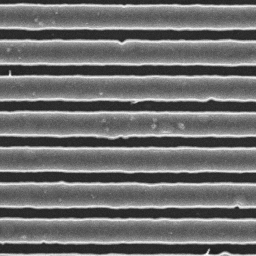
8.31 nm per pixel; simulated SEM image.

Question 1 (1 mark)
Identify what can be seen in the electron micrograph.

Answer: parallel lines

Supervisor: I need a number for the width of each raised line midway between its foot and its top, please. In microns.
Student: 0.204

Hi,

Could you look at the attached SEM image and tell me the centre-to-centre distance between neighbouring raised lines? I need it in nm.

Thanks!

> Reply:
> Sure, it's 296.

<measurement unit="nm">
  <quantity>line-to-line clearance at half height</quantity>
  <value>94.6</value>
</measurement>